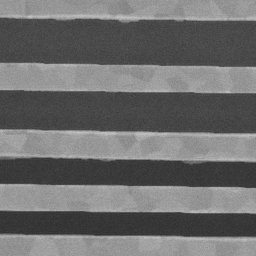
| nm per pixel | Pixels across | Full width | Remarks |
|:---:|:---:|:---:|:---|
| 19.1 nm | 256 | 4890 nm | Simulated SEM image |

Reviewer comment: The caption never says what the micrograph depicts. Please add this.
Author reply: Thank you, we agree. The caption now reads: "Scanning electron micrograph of lines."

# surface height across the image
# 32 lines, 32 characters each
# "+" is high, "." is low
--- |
++++++++++++++++++++++++++++++++
++++++++++++++++++++++++++++++++
.........................+++++++
................................
................................
................................
................................
................................
++++++++++++++++++++++++++++++++
++++++++++++++++++++++++++++++++
++++++++++++++++++++++++++++++++
.........................+++++++
................................
................................
................................
................................
+++++++++++.....................
++++++++++++++++++++++++++++++++
++++++++++++++++++++++++++++++++
...+++++++++++++++++++++++++++++
................................
................................
................................
+++++++++++++++++++++++++++++++.
++++++++++++++++++++++++++++++++
++++++++++++++++++++++++++++++++
.......................+++++++++
................................
................................
++++++++++......................
++++++++++++++++++++++++++++++++
++++++++++++++++++++++++++++++++